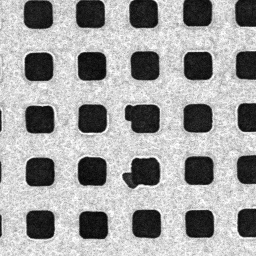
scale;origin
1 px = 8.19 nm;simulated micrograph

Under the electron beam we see a regular array of holes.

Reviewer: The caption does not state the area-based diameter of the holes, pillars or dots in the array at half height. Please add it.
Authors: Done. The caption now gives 257 nm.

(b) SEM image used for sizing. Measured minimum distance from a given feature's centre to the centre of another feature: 428 nm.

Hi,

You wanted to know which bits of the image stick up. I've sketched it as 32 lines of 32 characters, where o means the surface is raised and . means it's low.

ooo...oooo...ooo....ooo...ooo...
ooo....oo....ooo....ooo....oo...
ooo....ooo...ooo....ooo...ooo...
oooo..oooo..ooooo..ooooooooooooo
oooooooooooooooooooooooooooooooo
oooooooooooooooooooooooooooooooo
ooooo.ooooo.ooooo..ooooo..oooo..
ooo....ooo...ooo....ooo....oo...
ooo....ooo...ooo....ooo....oo...
ooo....ooo...oooo...ooo....ooo..
oooooooooooooooooooooooooooooooo
oooooooooooooooooooooooooooooooo
oooooooooooooooooooooooooooooooo
ooo....ooo...ooo....ooo...oooo..
ooo....ooo...ooo....ooo....ooo..
ooo....ooo...ooo....ooo....ooo..
oooo..oooo...oooo..ooooo..ooooo.
oooooooooooooooooooooooooooooooo
oooooooooooooooooooooooooooooooo
oooooooooooooooooooooooooooooo..
ooo....ooo...ooo....ooo....ooo..
ooo....ooo...ooo....ooo....ooo..
ooo....ooo...oo.....ooo....ooo..
oooooooooooooooooooooooooooooooo
oooooooooooooooooooooooooooooooo
oooooooooooooooooooooooooooooooo
oooo..oooo...oooo...ooo...oooo..
ooo....ooo...ooo....ooo....ooo..
ooo....ooo....oo....ooo....ooo..
ooo....ooo...oooo...oooo..oooo..
oooooooooooooooooooooooooooooooo
oooooooooooooooooooooooooooooooo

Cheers